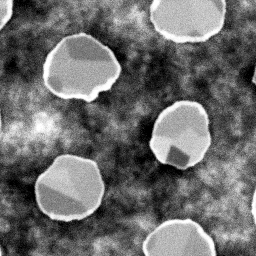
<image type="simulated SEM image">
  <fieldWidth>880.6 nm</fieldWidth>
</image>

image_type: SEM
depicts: raised bodies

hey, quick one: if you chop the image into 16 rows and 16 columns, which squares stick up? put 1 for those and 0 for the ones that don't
1000000001111100
0000000000111100
0000110000011000
0001111000000000
0001111000000000
0001111000000000
0000000000010000
0000000000111000
0000000000111000
0000000000111000
0001110000000000
0011110000000000
0011110000000000
0001100000000000
0000000000111000
0000000001111000